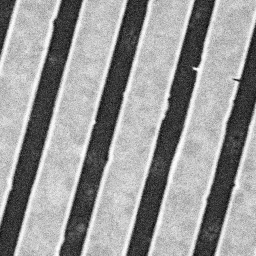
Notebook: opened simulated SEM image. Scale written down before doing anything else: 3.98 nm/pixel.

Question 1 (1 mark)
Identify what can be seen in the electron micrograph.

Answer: one or a few lines or trenches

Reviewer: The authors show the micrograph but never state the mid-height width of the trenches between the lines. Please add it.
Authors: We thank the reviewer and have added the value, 105 nanometres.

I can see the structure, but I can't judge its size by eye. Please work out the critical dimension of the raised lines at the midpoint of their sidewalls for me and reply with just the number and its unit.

156 nm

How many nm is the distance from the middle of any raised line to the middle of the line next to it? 257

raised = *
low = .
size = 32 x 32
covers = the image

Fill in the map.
..*****....*****...*****...*****
..*****...*****....*****...*****
..****....*****...*****....*****
.*****....*****...*****...*****.
.*****...*****....*****...*****.
.*****...*****....*****...*****.
.*****...*****...*****....*****.
*****....*****...*****...*****..
*****...*****....*****...*****..
*****...*****...******...*****..
****....*****...*****....****...
****....****....*****...*****...
****...*****....*****...*****...
****...*****...******...*****...
***....*****...*****....****....
***....****....*****...*****....
***...*****....*****...*****...*
***...*****...*****....*****...*
**....*****...*****....****....*
**....****....*****...*****....*
**...*****....*****...*****...**
**...*****...*****....*****...**
*....*****...*****...*****....**
*...*****....*****...*****....**
*...*****...*****....*****...***
....*****...*****...*****....***
...*****....*****...*****....***
...*****....*****...*****...****
...*****...*****....*****...****
...*****...*****...*****....****
..*****....*****...*****....****
..*****....*****...*****...*****